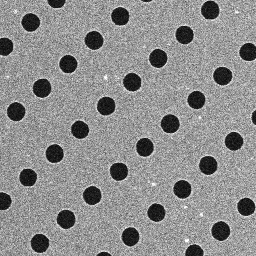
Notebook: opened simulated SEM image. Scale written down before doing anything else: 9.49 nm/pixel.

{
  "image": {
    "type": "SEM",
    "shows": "a regular array of holes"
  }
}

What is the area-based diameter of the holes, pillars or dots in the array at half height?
18.6 pixels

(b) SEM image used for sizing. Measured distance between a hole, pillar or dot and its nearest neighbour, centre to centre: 334 nm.